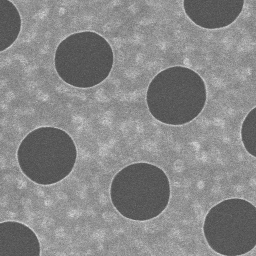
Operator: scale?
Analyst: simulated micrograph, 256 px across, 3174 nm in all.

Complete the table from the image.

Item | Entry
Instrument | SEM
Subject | holes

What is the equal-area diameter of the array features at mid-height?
726 nm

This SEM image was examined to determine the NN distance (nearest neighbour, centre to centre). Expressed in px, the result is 99.6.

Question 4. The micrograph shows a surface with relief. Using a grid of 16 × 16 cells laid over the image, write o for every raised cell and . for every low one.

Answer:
.ooooooooooo...o
.ooooooooooo..oo
.ooo...ooooooooo
ooo....ooooooooo
oooo...ooo..oooo
ooooooooo....ooo
ooooooooo....ooo
oooooooooo..ooo.
oo..ooooooooooo.
o....ooooooooooo
o....ooo..oooooo
ooooooo....ooooo
ooooooo....ooo.o
oooooooo..ooo...
..ooooooooooo...
..ooooooooooo...